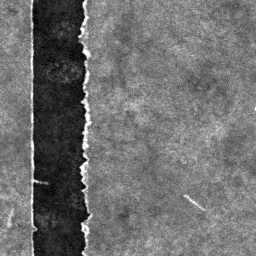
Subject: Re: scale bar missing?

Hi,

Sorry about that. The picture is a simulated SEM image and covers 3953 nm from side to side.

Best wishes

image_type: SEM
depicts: one or a few lines or trenches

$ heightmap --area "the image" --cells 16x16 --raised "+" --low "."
++...+++++++++++
++...+++++++++++
++...+++++++++++
++...+++++++++++
++...+++++++++++
++...+++++++++++
++...+++++++++++
++...+++++++++++
++...+++++++++++
++...+++++++++++
++...+++++++++++
++...+++++++++++
++...+++++++++++
++...+++++++++++
++...+++++++++++
++...+++++++++++